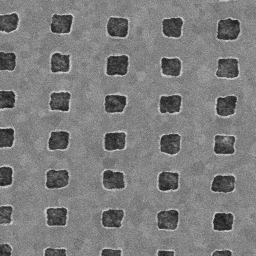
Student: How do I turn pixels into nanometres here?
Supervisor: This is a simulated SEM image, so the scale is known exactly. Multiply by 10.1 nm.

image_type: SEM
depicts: a regular array of holes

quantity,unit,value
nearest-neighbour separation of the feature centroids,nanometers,383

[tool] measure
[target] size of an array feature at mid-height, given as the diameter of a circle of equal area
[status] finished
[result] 222 nm